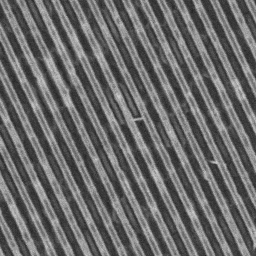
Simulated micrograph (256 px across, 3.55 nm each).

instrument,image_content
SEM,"parallel lines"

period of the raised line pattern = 15.9 pixels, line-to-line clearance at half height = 35.8 nm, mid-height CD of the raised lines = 19.7 nm